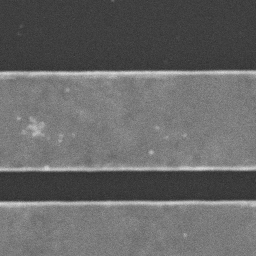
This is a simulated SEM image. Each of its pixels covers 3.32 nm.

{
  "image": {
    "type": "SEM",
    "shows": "wiring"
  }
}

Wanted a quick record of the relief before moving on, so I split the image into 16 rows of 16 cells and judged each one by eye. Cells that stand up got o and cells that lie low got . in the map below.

................
................
................
................
................
oooooooooooooooo
oooooooooooooooo
oooooooooooooooo
oooooooooooooooo
oooooooooooooooo
oooooooooooooooo
................
................
oooooooooooooooo
oooooooooooooooo
oooooooooooooooo